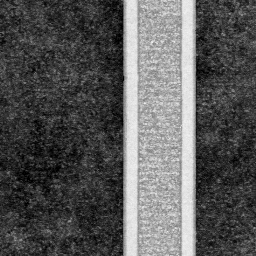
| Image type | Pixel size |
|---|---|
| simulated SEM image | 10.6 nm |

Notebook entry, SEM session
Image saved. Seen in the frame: one or a few lines or trenches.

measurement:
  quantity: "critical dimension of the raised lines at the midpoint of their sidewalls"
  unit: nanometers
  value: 590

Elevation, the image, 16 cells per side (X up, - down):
--------XXXX----
--------XXXX----
--------XXXX----
--------XXXX----
--------XXXX----
--------XXXX----
--------XXXX----
--------XXXX----
--------XXXX----
--------XXXX----
--------XXXX----
--------XXXX----
--------XXXX----
--------XXXX----
--------XXXX----
--------XXXX----